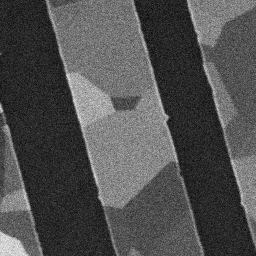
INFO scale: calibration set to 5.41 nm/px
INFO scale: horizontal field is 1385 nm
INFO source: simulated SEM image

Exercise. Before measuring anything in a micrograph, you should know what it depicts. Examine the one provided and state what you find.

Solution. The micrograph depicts one or a few lines or trenches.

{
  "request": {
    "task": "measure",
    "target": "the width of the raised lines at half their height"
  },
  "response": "448 nm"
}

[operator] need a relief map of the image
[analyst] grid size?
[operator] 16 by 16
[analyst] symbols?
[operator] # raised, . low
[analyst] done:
...#####....####
...######...####
....#####...####
....#####....###
....######...###
....######...###
.....#####....##
.....#####....##
#....######...##
#.....#####...##
#.....#####....#
#.....#####....#
##....######...#
##.....#####...#
##.....#####....
###....######...